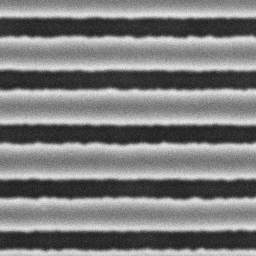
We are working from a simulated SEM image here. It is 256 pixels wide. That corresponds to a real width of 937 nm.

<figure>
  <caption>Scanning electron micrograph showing lines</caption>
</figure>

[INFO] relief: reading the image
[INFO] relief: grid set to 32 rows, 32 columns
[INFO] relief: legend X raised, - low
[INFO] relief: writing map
XXXXXXXXXXXXXXXXXXXXXXXXXXXXXXXX
XXXXXXXXXXXXXXXXXXXXXXXXXXXXXXXX
--------------------------------
--------------------------------
--------------------------------
XXXXXXXXXXXXXXXXXXXXXXXXXXXXXXXX
XXXXXXXXXXXXXXXXXXXXXXXXXXXXXXXX
XXXXXXXXXXXXXXXXXXXXXXXXXXXXXXXX
XXXXXXXXXXXXXXXXXXXXXXXXXXXXXXXX
--------------------------------
--------------------------------
XXXXXXXXXXXXXXXXXXXXXXXXXXXXXXXX
XXXXXXXXXXXXXXXXXXXXXXXXXXXXXXXX
XXXXXXXXXXXXXXXXXXXXXXXXXXXXXXXX
XXXXXXXXXXXXXXXXXXXXXXXXXXXXXXXX
XXXXX-XXXXXXXXXXXXXXXXXXXXXXXXXX
--------------------------------
--------------------------------
XXXXXXXXXXXXXXXXXXXXXXXXXXXXXXXX
XXXXXXXXXXXXXXXXXXXXXXXXXXXXXXXX
XXXXXXXXXXXXXXXXXXXXXXXXXXXXXXXX
XXXXXXXXXXXXXXXXXXXXXXXXXXXXXXXX
----------------------------X---
--------------------------------
--------------------------------
XXXXXXXXXXXXXXXXXXXXXXXXXXXXXXXX
XXXXXXXXXXXXXXXXXXXXXXXXXXXXXXXX
XXXXXXXXXXXXXXXXXXXXXXXXXXXXXXXX
XXXXXXXXXXXXXXXXXXXXXXXXXXXXXXXX
--------------------------------
--------------------------------
XXXXXXXXXXXXXXXXXXXXXXXXXXXXXXXX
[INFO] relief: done